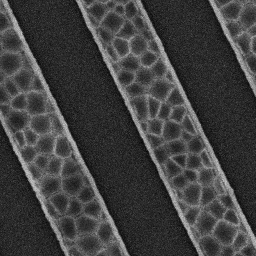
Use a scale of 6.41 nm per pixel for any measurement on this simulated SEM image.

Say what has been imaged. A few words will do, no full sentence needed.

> one or a few lines or trenches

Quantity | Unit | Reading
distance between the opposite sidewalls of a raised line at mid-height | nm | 354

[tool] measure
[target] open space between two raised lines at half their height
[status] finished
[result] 420 nm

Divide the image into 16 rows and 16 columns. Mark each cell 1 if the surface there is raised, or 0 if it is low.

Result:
1000011110000111
1000001110000011
1000001111000011
1100000111000001
1100000111100001
1110000111100000
1110000011110000
1111000011110000
0111000001111000
0111100001111000
0011100000111100
0011110000111100
0001110000011110
0001111000011110
0000111000001111
0000111100001111